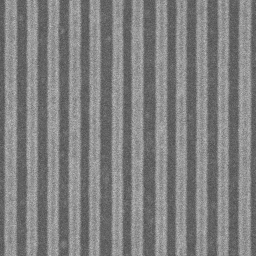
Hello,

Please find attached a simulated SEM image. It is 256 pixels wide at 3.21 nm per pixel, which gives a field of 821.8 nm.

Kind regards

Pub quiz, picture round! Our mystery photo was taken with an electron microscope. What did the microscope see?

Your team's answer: parallel lines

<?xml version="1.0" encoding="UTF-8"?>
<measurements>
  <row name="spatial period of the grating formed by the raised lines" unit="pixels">21.3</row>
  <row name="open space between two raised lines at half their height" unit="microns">0.0433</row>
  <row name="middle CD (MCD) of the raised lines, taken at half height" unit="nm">26.1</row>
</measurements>